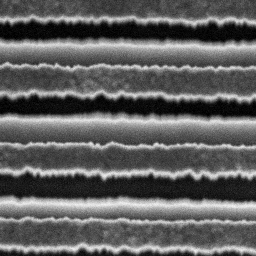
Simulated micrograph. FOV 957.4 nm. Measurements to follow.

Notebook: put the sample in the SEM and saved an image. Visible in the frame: lines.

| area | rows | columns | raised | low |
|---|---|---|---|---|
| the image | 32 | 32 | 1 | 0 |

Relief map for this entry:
11111111111111111111111111111111
11111111111111111111111111111111
11000100110100000111011111011111
00000000000000000000000000000000
00000000000000000000000000000000
11111011100111111000000000000000
11111111111111111111111111111111
11111111111111111111111111111111
11111111111111111111111111111111
11111111111111111111111111111111
11111111111111111111111111111111
11111111111111111111111111111111
00000000000000000000000000000000
00000000000000000000000000000000
00000000000000000000000000000000
11111111111111111111111111111111
11111111111111111111111111111111
11111111111111111111111111111111
11111111111111111111111111111111
11111111111111111111111111111111
11111111111111111111111111111111
01101111101111111111111111111111
00000000000000000000000000000000
00000000000000000000000000000000
00000000000000000000000000000000
11111111111111111111101101000000
11111111111111111111111111111111
11111111111111111111111111111111
11111111111111111111111111111111
11111111111111111111111111111111
11111111111111111111111111111111
00000000000000000000000000000000